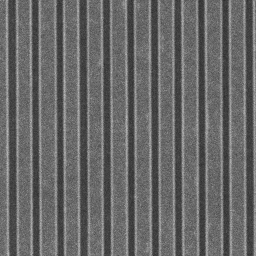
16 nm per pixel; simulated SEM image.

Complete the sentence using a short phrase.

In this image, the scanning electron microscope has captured parallel lines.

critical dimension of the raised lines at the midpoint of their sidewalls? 250 nm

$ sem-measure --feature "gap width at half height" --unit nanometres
134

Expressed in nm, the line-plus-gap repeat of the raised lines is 378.